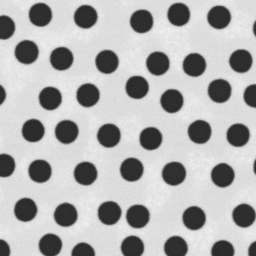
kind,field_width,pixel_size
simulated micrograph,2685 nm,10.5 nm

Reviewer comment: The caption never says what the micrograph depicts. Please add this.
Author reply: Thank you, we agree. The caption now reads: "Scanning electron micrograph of a regular array of holes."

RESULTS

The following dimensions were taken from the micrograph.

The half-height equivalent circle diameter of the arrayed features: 249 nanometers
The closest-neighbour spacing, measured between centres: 393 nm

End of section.